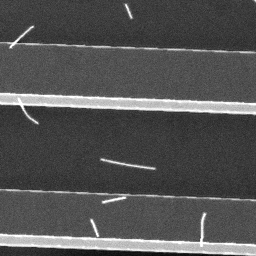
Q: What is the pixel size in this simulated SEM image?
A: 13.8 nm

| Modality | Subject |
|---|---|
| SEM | lines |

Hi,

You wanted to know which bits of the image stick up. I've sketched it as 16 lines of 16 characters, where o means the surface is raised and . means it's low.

................
................
................
oooooooooooooooo
oooooooooooooooo
oooooooooooooooo
oooooooooooooooo
................
................
................
................
................
oooooooooooooooo
oooooooooooooooo
oooooooooooooooo
.....ooooooooooo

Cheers